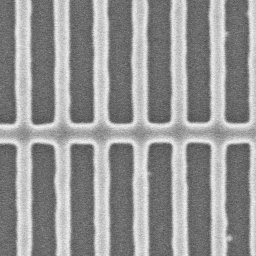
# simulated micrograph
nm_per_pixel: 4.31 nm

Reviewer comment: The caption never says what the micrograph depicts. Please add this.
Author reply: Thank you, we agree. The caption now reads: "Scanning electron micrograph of groups of lines, slits or small figures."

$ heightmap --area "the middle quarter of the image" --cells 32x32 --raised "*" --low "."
*.......***......***.......***..
*.......***......***.......***..
*.......***......****......***..
*.......***......****......***..
*.......***......****......***..
*.......***......****......***..
*.......***......****......***..
*.......***......****......***..
*.......***......****......***..
*.......***......****......***..
*.......***......****......***..
*.......***......****......***..
*.......***.......***......***..
*.......***.......***......***..
*.......***......****......****.
********************************
********************************
********************************
********************************
*************..*******....*****.
*.......***......****......***..
*.......***.......***......***..
*.......***.......***......***..
*.......***.......***......***..
*.......***.......***......***..
*.......***.......**.......***..
*.......***.......**.......***..
*.......***.......***......***..
*.......***......****......***..
*.......***......****......***..
*.......***......****......***..
*.......***.......***......***..